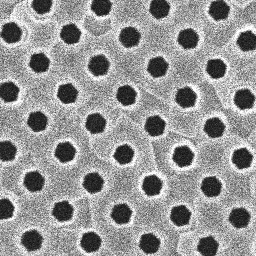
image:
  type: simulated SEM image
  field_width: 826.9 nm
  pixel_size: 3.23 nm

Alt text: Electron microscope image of a regular array of holes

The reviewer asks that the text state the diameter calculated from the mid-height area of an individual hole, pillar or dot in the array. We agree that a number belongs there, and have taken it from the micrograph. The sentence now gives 65.5 nanometers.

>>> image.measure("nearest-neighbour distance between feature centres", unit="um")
0.134